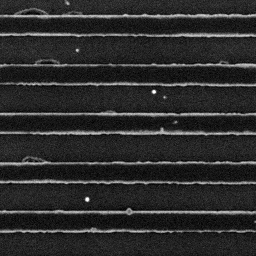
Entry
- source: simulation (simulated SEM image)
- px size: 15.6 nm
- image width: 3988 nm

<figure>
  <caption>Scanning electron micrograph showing lines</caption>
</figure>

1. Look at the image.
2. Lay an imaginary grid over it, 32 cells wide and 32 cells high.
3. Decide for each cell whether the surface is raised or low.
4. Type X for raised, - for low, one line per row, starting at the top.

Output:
--------------------------------
--------------------------------
XXXXXXXXXXXXXXXXXXXXXXXXXXXXXXXX
XXXXXXXXXXXXXXXXXXXXXXXXXXXXXXXX
---------XX-----X-XXXXX-XXXXXXXX
--------------------------------
--------------------------------
--------------------------------
XXXXXXXXXXXXXXXXXXXXXXXXXXXXXXXX
XXXXXXXXXXXXXXXXXXXXXXXXXXXXXXXX
---XXXXXXXXXXXX-XXXXXXXXXXXXXXXX
--------------------------------
--------------------------------
--------------------------------
XXXXXXXXXXXXXXXXXXXXXXXXXXXXXXXX
XXXXXXXXXXXXXXXXXXXXXXXXXXXXXXXX
XXXXXXXXXXXXXXXXXXXXXXXXXXXXXXXX
--------------------------------
--------------------------------
--------------------------------
XXXXXXXXXXXXXXXXXXXXXXXXXXXXXXXX
XXXXXXXXXXXXXXXXXXXXXXXXXXXXXXXX
XXXXXXXXXXXXXXXXXXXXXXXXXXXXXXXX
--------------------------------
--------------------------------
--------------------------------
XXXXXXXXXXXXXXXXXXXXXXXXXXX-XXXX
XXXXXXXXXXXXXXXXXXXXXXXXXXXXXXXX
XXXXXXXXXXXXXXXXXXXXXXXXXXXXXXXX
--------------------------------
--------------------------------
--------------------------------